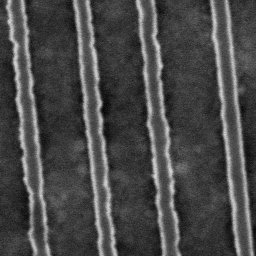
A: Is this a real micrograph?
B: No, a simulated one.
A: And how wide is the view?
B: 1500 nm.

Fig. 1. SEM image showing one or a few lines or trenches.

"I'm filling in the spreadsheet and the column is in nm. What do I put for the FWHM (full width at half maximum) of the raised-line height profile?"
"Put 87.4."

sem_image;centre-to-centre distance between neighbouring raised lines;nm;395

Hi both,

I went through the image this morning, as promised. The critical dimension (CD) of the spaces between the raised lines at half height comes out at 303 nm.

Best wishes